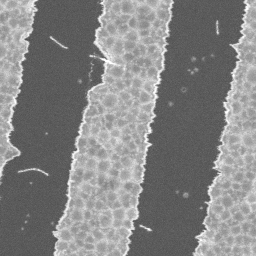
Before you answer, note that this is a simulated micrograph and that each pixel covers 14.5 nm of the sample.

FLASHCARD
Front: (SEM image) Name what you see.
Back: one or a few lines or trenches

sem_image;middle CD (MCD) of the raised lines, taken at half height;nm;912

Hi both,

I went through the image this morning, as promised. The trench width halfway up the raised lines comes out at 1030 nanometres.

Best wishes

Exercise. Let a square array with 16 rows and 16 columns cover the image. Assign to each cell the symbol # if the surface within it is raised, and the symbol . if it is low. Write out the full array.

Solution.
##....#####....#
##....#####....#
##....####.....#
#......###.....#
#......###.....#
#.....####....##
#.....####....##
#....####.....##
#....####.....##
#....####.....##
....#####.....##
....#####....###
....#####....###
....#####....###
....####.....###
...#####....####